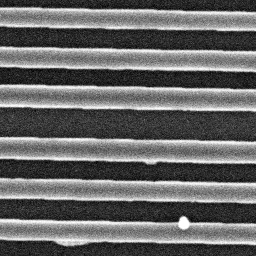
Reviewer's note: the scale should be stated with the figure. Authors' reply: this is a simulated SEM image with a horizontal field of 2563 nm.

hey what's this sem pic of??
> lines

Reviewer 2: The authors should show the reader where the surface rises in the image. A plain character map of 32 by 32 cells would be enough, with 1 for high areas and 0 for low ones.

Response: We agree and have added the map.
00000000000000000000000000000000
11111111111111111111111111010000
11111111111111111111111111111111
00000000000000111111111111111111
00000000000000000000000000000000
00000000000000000000000000000000
11111111111111111111111111111110
11111111111111111111111111111111
00000000111111111111111111111111
00000000000000000000000000000000
00000000000000000000000000000000
11111111111111111111111111111111
11111111111111111111111111111111
00000000001111111111111111111111
00000000000000000000000000000000
00000000000000000000000000000000
00000000000000000000000000000000
11111111111111110000000000000000
11111111111111111111111111111111
11111111111111111111111111111111
00000000000000000000000000000000
00000000000000000000000000000000
11111111110000000000000000000000
11111111111111111111111111111111
11111111111111111111111111111111
00000000000000000000000000000000
00000000000000000000000000000000
00000000000000000000000000000000
11111111111111111111111111111111
11111111111111111111111111111111
00000000000000000000000000000000
00000000000000000000000000000000